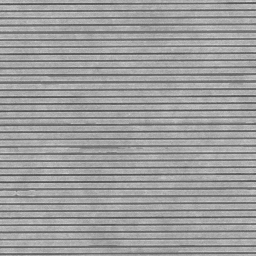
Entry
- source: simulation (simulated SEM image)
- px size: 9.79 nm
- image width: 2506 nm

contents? parallel lines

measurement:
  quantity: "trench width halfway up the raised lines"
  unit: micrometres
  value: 0.0196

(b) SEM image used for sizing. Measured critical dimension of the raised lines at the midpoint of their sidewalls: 48.9 nanometers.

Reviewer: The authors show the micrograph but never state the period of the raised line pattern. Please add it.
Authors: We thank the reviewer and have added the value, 69.9 nanometres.